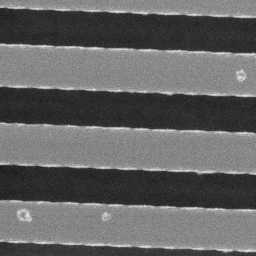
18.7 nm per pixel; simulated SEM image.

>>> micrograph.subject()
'lines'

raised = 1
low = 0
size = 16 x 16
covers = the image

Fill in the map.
1111111111111111
0000000000000000
0000000000000000
1111111111111111
1111111111111111
0011111111111111
0000000000000000
0000000000000000
1111111111111111
1111111111111111
0000011111111111
0000000000000000
0000000000000000
1111111111111111
1111111111111111
0000000000111111